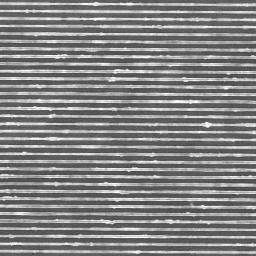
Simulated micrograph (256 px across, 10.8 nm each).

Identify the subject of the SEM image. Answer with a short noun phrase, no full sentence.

parallel lines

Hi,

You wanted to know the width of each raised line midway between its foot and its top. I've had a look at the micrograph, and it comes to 29.6 nanometers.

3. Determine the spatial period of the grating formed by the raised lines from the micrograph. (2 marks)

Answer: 80.6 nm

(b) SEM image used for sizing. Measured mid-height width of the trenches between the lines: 0.051 µm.